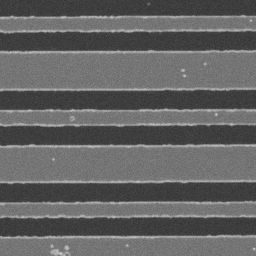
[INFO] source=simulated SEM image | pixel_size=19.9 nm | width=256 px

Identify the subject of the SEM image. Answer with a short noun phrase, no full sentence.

lines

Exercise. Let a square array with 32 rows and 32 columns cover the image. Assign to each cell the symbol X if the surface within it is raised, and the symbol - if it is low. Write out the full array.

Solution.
--------------------------------
--------------------------------
XXXXXXXXXXXXXXXXXXXXXXXXXXXXXXXX
XXXXXXXXXXXXXXXXXXXXXXXXXXXXXXXX
--------------------------------
--------------------------------
-X--XXXXXXXXXXXXXXXXXXXXXXXXXXXX
XXXXXXXXXXXXXXXXXXXXXXXXXXXXXXXX
XXXXXXXXXXXXXXXXXXXXXXXXXXXXXXXX
XXXXXXXXXXXXXXXXXXXXXXXXXXXXXXXX
XXXXXXXXXXXXXXXXXXXXXXXXXXXXXXXX
--------------------------------
--------------------------------
--------------------------------
XXXXXXXXXXXXXXXXXXXXXXXXXXXXXXXX
XXXXXXXXXXXXXXXXXXXXXXXXXXXXXXXX
--------------------------------
--------------------------------
XXXXXXXXXXXXXXXXXXXXXXXXXXXXXXXX
XXXXXXXXXXXXXXXXXXXXXXXXXXXXXXXX
XXXXXXXXXXXXXXXXXXXXXXXXXXXXXXXX
XXXXXXXXXXXXXXXXXXXXXXXXXXXXXXXX
XXXXXXXXXXXXXXXXXXXXXXXXXXXXXXXX
--------------------------------
--------------------------------
XXXXXXXXXXXXXXXXXXXXXXXXXXXXXXXX
XXXXXXXXXXXXXXXXXXXXXXXXXXXXXXXX
--------------------------------
--------------------------------
---------------------------X----
XXXXXXXXXXXXXXXXXXXXXXXXXXXXXXXX
XXXXXXXXXXXXXXXXXXXXXXXXXXXXXXXX